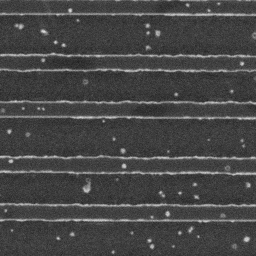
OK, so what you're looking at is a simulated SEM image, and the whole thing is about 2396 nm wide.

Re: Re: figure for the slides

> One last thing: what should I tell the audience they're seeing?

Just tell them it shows lines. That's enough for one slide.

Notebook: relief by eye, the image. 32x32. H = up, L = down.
HHHHHHHHHHHHHHHHHHHHHHHHHHHHHHHH
HHHHHHHHHHHHHHHHHHHHHHHHHHHHHHHH
LLLLLLLLLLLLLLLLLLLLLLLLLLLLLLLL
LLLLLLLLLLLLLLLLLLLLLLLLLLLLLLLL
LLLLLLLLLLLLLLLLLLLLLLLLLLLLLLLL
LLLLLLLLLLLLLLLLLLLLLLLLLLLLLLLL
LLLLLLLLLLLLLLLLLLLLLLLLLLLLLLLL
HHHHHHHHHHHHHHHHHHHHHHHHHHHHHHHH
HHHHHHHHHHHHHHHHHHHHHHHHHHHHHHHH
LLLLLLLLLLLLLLLLLLLLLLLLLLLLLLLL
LLLLLLLLLLLLLLLLLLLLLLLLLLLLLLLL
LLLLLLLLLLLLLLLLLLLLLLLLLLLLLLLL
LLLLLLLLLLLLLLLLLLLLLLLLLLLLLLLL
HHHHHHHHHHHHHHHHHHHHHHHHHHHHHHHH
HHHHHHHHHHHHHHHHHHHHHHHHHHHHHHHH
LLLLLLLLLLLLLLLLLLLLLLLLLLLLLLLL
LLLLLLLLLLLLLLLLLLLLLLLLLLLLLLLL
LLLLLLLLLLLLLLLLLLLLLLLLLLLLLLLL
LLLLLLLLLLLLLLLLLLLLLLLLLLLLLLLL
LLLLLLLLLLLLLLLLLLLLLLLLLLLLLLLL
HHHHHHHHHHHHHHHHHHHHHHHHHHHHHHHH
HHHHHHHHHHHHHHHHHHHHHHHHHHHHHHHH
LLLLLLLLLLLLLLLLLLLLLLLLLLLLLLLL
LLLLLLLLLLLLLLLLLLLLLLLLLLLLLLLL
LLLLLLLLLLLLLLLLLLLLLLLLLLLLLLLL
LLLLLLLLLLLLLLLLLLLLLLLLLLLLLLLL
HHHHHHHHHHHHHHHHHHHHHHHHHHHHHHHH
HLHLLHHHHLHHHHHHHHHHHHHHHHHHHHHH
LLLLLLLLLLLLLLLLLLLLLLLLLLLLLLLL
LLLLLLLLLLLLLLLLLLLLLLLLLLLLLLLL
LLLLLLLLLLLLLLLLLLLLLLLLLLLLLLLL
LLLLLLLLLLLLLLLLLLLLLLLLLLLLLLLL